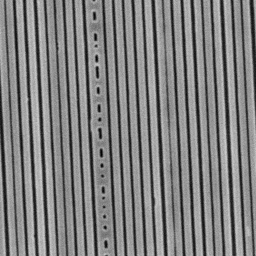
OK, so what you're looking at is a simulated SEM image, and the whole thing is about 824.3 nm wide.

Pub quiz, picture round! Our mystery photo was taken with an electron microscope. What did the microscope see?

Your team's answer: parallel lines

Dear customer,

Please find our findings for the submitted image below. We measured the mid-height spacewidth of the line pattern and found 11.2 nm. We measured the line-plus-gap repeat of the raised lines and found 0.0316 micrometres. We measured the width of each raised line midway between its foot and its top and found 20.1 nanometers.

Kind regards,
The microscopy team